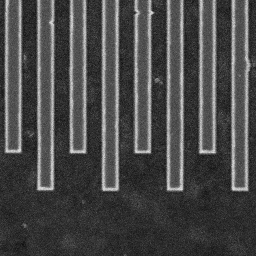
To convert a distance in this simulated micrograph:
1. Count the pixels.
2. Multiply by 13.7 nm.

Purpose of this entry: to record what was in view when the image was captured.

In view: parallel lines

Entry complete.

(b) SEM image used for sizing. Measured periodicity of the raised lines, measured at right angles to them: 443 nanometres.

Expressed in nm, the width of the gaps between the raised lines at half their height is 243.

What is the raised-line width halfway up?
14.3 pixels